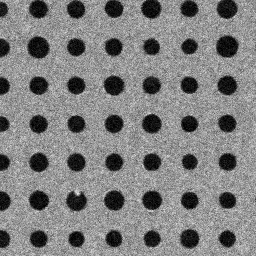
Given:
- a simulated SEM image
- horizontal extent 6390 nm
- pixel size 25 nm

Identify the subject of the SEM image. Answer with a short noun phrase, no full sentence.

a regular array of holes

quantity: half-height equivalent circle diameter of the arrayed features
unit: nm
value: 472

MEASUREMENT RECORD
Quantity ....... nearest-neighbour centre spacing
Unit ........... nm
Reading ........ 939